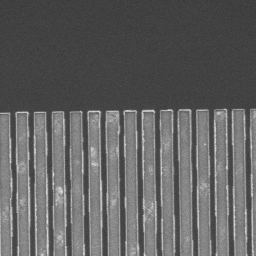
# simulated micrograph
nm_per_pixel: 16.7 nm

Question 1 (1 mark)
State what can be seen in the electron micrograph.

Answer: parallel lines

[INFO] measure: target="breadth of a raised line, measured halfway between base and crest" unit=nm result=117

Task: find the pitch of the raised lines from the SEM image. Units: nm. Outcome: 301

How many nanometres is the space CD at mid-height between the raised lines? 186